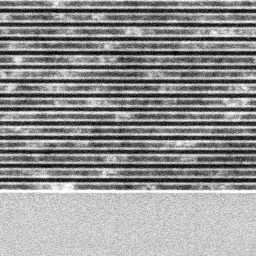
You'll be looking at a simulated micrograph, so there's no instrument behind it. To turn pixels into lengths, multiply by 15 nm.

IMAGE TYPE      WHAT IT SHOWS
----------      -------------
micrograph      parallel lines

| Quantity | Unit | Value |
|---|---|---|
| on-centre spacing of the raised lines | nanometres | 211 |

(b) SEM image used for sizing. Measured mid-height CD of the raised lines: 0.133 µm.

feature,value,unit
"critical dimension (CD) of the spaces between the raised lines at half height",80.4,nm